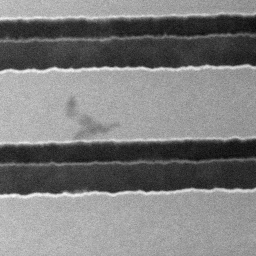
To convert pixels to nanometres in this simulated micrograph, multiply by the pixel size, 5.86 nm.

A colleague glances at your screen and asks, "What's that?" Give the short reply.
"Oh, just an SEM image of lines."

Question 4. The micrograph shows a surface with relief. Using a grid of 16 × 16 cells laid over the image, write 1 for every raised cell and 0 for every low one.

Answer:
1111111111111111
0000000000000000
0000000000000000
0000000000000000
1111111111111111
1111111111111111
1111111111111111
1111111111111111
1111111111111111
0000000000000000
0000000000000000
0000000000000000
1111111111111111
1111111111111111
1111111111111111
1111111111111111